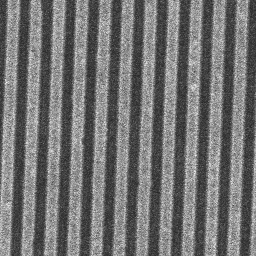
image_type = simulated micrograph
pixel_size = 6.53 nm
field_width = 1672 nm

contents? parallel lines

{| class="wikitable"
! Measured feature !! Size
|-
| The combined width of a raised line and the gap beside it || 0.149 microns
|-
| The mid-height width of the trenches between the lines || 0.0726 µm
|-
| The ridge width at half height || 77.5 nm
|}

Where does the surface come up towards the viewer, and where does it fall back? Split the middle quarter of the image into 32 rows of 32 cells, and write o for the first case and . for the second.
...oo...ooo...ooo...oo....oo...o
...oo...ooo...ooo...oo...ooo...o
...oo...ooo...ooo...oo...ooo...o
...oo...ooo...ooo...oo...ooo...o
...oo...ooo...ooo...oo...ooo...o
..ooo...ooo...ooo...oo...ooo...o
..ooo...ooo...oo....oo...ooo...o
..ooo...ooo...oo....oo...ooo...o
..ooo...ooo...oo....oo...ooo...o
..ooo...ooo...oo....oo...ooo...o
..ooo...ooo...oo....oo...ooo...o
..ooo...ooo...oo...ooo...ooo...o
..ooo...ooo...oo...ooo...ooo...o
..ooo...oo....oo...ooo...ooo...o
..ooo...oo....oo...ooo...ooo...o
..ooo...oo....oo...ooo...ooo...o
..ooo...ooo...oo...ooo...ooo...o
..ooo...oo....oo...ooo...ooo...o
..ooo...oo...ooo...ooo...ooo...o
..ooo...oo...ooo...ooo...oo....o
..ooo...oo...ooo...ooo...oo....o
..ooo...oo...ooo...ooo...oo....o
..ooo...oo...ooo...ooo...oo....o
..ooo...oo...ooo...ooo...oo....o
..ooo...oo...ooo...ooo...oo....o
..ooo..ooo...ooo...ooo...oo...oo
..oo...ooo...ooo...oo....oo...oo
..oo...ooo...ooo...oo....oo...oo
..oo...ooo...ooo...oo....oo...oo
..oo...ooo...ooo...ooo...oo...oo
..oo...ooo...ooo...ooo...oo...oo
..oo...ooo...ooo...oo....oo...oo